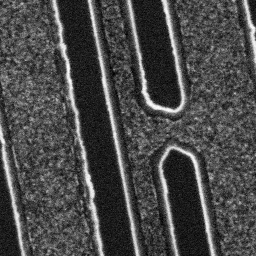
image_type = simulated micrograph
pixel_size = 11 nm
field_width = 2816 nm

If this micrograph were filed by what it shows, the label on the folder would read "one or a few lines or trenches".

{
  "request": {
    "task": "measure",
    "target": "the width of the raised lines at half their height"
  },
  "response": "396 nm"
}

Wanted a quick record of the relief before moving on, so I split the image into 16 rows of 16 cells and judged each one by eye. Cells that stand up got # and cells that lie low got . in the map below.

...###..##.....#
....##..###.....
....##..###.....
....##...##.....
....##...##.....
....###..##.....
.....##..##.....
.....##.........
.....##.........
.....##...##....
.....###..##....
#.....##..##....
#.....##..###...
#.....##...##...
#.....##...##...
#.....###..##...